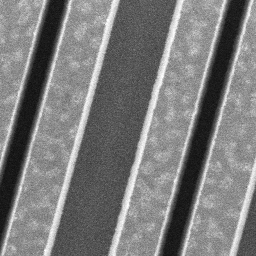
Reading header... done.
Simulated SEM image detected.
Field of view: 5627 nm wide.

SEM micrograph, one or a few lines or trenches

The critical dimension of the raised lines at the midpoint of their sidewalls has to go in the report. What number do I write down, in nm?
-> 1030